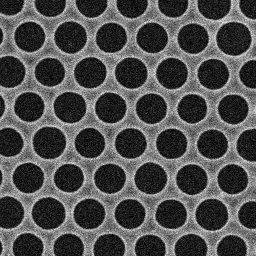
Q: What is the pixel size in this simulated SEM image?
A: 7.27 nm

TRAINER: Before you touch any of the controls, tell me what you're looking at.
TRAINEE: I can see a regular array of holes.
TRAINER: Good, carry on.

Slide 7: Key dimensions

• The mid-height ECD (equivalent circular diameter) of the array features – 230 nanometres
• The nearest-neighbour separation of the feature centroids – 294 nanometres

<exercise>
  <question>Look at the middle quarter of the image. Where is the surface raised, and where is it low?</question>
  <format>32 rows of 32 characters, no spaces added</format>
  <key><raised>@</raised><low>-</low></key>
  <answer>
@@@-------@@@-------@@@--------@
@@---------@@--------@@--------@
@@---------@@--------@@--------@
@@@--------@@--------@@--------@
@@@-------@@@-------@@@@-------@
@@@@-----@@@@@------@@@@@----@@@
@@@@@@@@@@@@@@@@@@@@@@@@@@--@@@@
----@@@@@@----@@@@@@@--@@@@@@@@-
-----@@@@------@@@@------@@@@@--
-----@@@--------@@-------@@@@---
------@@--------@@--------@@----
------@@--------@@--------@@----
-----@@@-------@@@--------@@----
-----@@@-------@@@@------@@@@---
---@@@@@@@---@@@@@@@----@@@@@@--
@@@@@@@@@@@@@@@@@@@@@@@@@@@@@@@@
@@@@----@@@@@@@----@@@@@@----@@@
@@@------@@@@-------@@@@------@@
-@@-------@@@--------@@--------@
-@--------@@@--------@@--------@
@@@-------@@@--------@@--------@
@@@-------@@@-------@@@--------@
@@@@-----@@@@@------@@@@------@@
@@@@@@-@@@@@@@@---@@@@@@@---@@@@
@@@@@@@@@@@@@@@@@@@@@-@@@@@@@@@@
---@@@@@@-----@@@@@-----@@@@@@--
----@@@@-------@@@-------@@@@---
-----@@@--------@@--------@@----
-----@@---------@@--------@@----
-----@@@-------@@@--------@@----
----@@@@-------@@@-------@@@----
---@@@@@@-----@@@@@------@@@@---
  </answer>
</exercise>